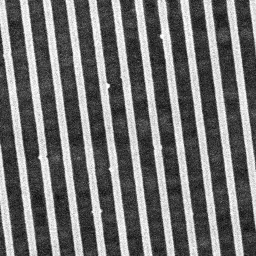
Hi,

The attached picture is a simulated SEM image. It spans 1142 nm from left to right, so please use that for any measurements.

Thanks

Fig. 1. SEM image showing parallel lines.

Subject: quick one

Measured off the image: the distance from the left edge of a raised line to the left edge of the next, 0.102 um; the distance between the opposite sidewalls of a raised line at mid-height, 31 nm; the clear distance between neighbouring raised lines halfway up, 69.2 nanometers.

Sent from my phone